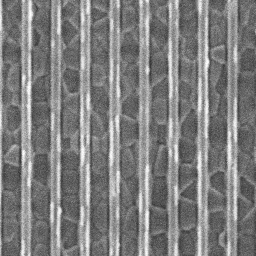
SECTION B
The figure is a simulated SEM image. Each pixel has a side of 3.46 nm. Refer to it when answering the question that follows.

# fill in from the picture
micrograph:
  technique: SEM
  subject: parallel lines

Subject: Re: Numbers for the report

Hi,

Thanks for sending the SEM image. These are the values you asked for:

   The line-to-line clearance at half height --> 0.0722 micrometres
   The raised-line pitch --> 0.102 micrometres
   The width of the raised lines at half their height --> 31.6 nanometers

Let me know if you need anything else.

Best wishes